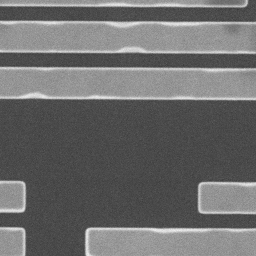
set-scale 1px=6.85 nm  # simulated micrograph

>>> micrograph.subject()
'groups of lines, slits or small figures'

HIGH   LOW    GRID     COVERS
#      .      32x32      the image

###############################.
................................
................................
################################
################################
################################
.......########...##############
................................
###.............................
################################
################################
################################
................................
................................
................................
................................
................................
................................
................................
................................
................................
................................
................................
###......................#######
###......................#######
###......................#######
.........................#######
................................
................................
###........#####################
###........#####################
###........#####################